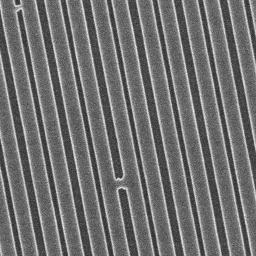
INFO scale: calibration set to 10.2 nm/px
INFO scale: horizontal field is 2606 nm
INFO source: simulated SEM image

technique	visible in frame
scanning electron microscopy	parallel lines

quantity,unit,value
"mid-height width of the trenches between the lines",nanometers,60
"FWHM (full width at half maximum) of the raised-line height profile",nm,158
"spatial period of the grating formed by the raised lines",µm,0.229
